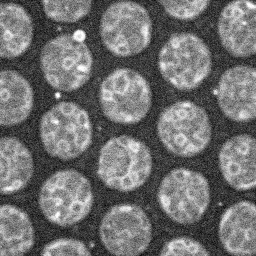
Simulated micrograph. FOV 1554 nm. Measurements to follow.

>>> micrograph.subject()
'a regular array of raised bodies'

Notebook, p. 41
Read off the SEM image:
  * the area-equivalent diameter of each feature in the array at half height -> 307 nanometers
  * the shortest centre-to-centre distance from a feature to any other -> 409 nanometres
